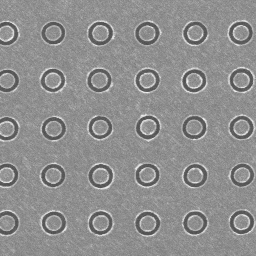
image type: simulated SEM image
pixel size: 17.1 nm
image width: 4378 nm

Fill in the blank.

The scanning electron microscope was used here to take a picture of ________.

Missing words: a regular array of ring-shaped grooves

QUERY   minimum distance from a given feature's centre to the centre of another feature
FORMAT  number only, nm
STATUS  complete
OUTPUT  799